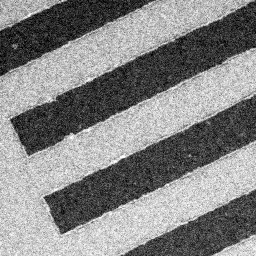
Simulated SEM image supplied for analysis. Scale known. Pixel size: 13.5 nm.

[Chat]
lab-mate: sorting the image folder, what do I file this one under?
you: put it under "one or a few lines or trenches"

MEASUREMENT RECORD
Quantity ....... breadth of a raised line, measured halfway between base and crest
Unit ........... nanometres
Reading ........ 587